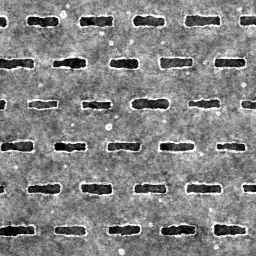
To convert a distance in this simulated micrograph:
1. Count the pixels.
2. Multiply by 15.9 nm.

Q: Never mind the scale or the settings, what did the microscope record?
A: a regular array of holes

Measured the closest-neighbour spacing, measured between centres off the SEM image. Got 773 nanometers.